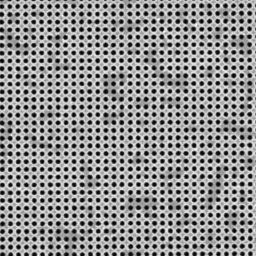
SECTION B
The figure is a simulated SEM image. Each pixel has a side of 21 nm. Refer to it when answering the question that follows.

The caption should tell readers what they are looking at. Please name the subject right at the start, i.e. a regular array of holes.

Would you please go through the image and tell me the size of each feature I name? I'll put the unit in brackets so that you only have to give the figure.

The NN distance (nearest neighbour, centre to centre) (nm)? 156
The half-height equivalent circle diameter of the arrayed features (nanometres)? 106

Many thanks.